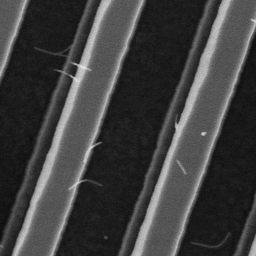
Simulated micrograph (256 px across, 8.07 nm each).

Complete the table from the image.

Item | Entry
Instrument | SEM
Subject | lines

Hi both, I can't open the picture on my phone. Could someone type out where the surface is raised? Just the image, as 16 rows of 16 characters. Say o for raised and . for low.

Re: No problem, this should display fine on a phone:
oo....ooo....ooo
o....ooo.....ooo
o....ooo.....ooo
....oooo....ooo.
....ooo.....ooo.
....ooo....oooo.
...oooo....ooo..
...ooo.....ooo..
...ooo....oooo..
...ooo....ooo...
..ooo.....ooo...
..ooo....ooo....
.oooo....ooo....
.ooo....oooo....
oooo....ooo....o
ooo.....ooo....o